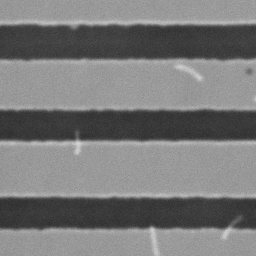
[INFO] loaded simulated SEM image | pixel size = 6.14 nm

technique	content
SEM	lines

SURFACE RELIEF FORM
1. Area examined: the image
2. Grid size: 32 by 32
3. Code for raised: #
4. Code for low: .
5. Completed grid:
################################
################################
################################
................................
................................
................................
................................
..........#.....###..######..#.#
################################
################################
################################
################################
################################
################################
................................
................................
................................
................................
################################
################################
################################
################################
################################
################################
################################
................................
................................
................................
................................
################################
################################
################################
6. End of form